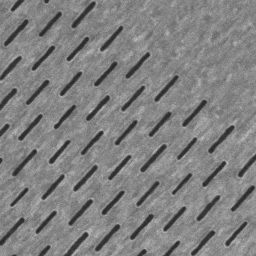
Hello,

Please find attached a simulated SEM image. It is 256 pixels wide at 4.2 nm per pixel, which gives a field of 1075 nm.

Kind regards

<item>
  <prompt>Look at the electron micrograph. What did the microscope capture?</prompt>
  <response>a regular array of holes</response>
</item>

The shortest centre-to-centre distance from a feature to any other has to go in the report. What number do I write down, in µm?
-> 0.145